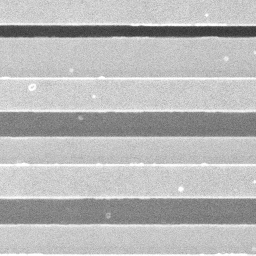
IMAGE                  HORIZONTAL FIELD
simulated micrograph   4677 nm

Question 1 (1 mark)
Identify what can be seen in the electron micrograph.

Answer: lines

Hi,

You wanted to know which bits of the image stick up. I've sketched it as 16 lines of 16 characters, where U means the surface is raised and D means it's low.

UUUUUUUUUUUUUUUU
UUUUUUUUUUUUUUUU
UUUUUUUUUUUUUUUU
UUUUUUUUUUUUUUUU
UUUUUUUUUUUUUUUU
UUUUUUUUUUUUUUUU
UUUUUUUUUUUUUUUU
DDDDDDDDDDDDDDDD
DDDDDDDDDDDDDDDD
UUUUUUUUUUUUUUUU
UUUUUUUUUUUUUUUU
UUUUUUUUUUUUUUUU
DDDDDDDDDDDDDDDD
DDDDDDDDDDDDDDDD
UUUUUUUUUUUUUUUU
UUUUUUUUUUUUUUUU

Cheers